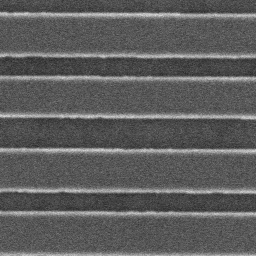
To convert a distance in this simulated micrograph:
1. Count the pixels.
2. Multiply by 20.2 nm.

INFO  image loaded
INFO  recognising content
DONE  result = lines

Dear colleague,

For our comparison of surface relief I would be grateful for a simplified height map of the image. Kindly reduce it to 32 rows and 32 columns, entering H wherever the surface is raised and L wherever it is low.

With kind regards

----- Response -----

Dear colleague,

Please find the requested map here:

LLLLLLLLLLLLLLLLLLLLLLLLLLLLLLLL
LLLLLLLLLLLLLLLLLLLLLLLLLLLLLLLL
HHHHHHHHHHHHHHHHHHHHHHHHHHHHHHHH
HHHHHHHHHHHHHHHHHHHHHHHHHHHHHHHH
HHHHHHHHHHHHHHHHHHHHHHHHHHHHHHHH
HHHHHHHHHHHHHHHHHHHHHHHHHHHHHHHH
HHHHHHHHHHHHHHHHHHHHHHHHHHHHHHHH
LLLLLLLLLLLLLLLLLLLLLLLLLLLLLLLL
LLLLLLLLLLLLLLLLLLLLLLLLLLLLLLLL
LLLLLLLLLLLLLLLLLLLLLLLLLLLLLLLL
HHHHHHHHHHHHHHHHHHHHHHHHHHHHHHHH
HHHHHHHHHHHHHHHHHHHHHHHHHHHHHHHH
HHHHHHHHHHHHHHHHHHHHHHHHHHHHHHHH
HHHHHHHHHHHHHHHHHHHHHHHHHHHHHHHH
HHHHHHHHHHHHHHHHHHHHHHHHHHHHHHHH
LLLLLLLLLLLLLLLLLLLLLLLLLLLLLLLL
LLLLLLLLLLLLLLLLLLLLLLLLLLLLLLLL
LLLLLLLLLLLLLLLLLLLLLLLLLLLLLLLL
LLLLLLLLLLLLLLLLLLLLLLLLLLLLLLLL
HHHHHHHHHHHHHHHHHHHHHHHHHHHHHHHH
HHHHHHHHHHHHHHHHHHHHHHHHHHHHHHHH
HHHHHHHHHHHHHHHHHHHHHHHHHHHHHHHH
HHHHHHHHHHHHHHHHHHHHHHHHHHHHHHHH
HHHHHHHHHHHHHHHHHHHHHHHHHHHHHHHH
LLLLLLLLLLLLLLLLLLLLLLLLLLLLLLLL
LLLLLLLLLLLLLLLLLLLLLLLLLLLLLLLL
LLLLLLLLLLLLLLLLLLLLLLLLLLLLLLLL
HHHHHHHHHHHHHHHHHHHHHHHHHHHHHHHH
HHHHHHHHHHHHHHHHHHHHHHHHHHHHHHHH
HHHHHHHHHHHHHHHHHHHHHHHHHHHHHHHH
HHHHHHHHHHHHHHHHHHHHHHHHHHHHHHHH
HHHHHHHHHHHHHHHHHHHHHHHHHHHHHHHH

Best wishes